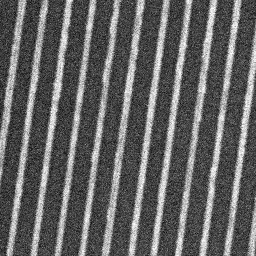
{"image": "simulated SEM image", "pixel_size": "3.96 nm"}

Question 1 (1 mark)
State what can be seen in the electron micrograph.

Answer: parallel lines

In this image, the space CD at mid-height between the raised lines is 74.6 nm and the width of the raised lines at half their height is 20.1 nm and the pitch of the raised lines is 0.0944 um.